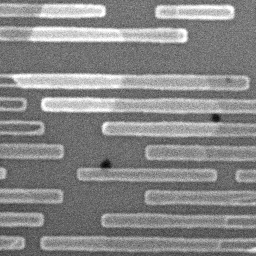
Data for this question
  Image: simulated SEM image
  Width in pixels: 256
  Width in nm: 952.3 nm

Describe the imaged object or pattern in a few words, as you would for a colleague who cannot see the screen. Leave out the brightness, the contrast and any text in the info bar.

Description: wiring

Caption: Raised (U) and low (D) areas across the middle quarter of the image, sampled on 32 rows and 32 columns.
DDDDDDDDDDDDDDDDDDDDDDDDDDDDDDDD
DDDDDDDDDDDDDDDDDDDDDDDDDDDDDDDD
DDDDDDDDDDDDDDDDDDDDDDDDDDDDDDDD
UUUUUUUUUUUUUUUUUUUUUUUUUUUUUUUU
UUUUUUUUUUUUUUUUUUUUUUUUUUUUUUUU
UUUUUUUUUUUUUUUUUUUUUUUUUUUUUUUU
DDDDDDDDDDDDDDDDDDDDDDDDDDDDDDDD
DDDDDDDDDDDDDDDDDDDDDDDDDDDDDDDD
DDDDDDDDDDDDDDDDDDDDDDDDDDDDDDDD
UUUUUUUUUUUUUUUUUUUUUUUUUUUUUUUU
UUUUUUUUUUUUUUUUUUUUUUUUUUUUUUUU
UUUUUUUUUUUUUUUUUUUUUUUUUUUUUUUU
DDDDDDDDDDDDDDDDDDDDDDDDDDDDDDDD
DDDDDDDDDDDDDDDDDDDDDDDDDDDDDDDD
DDDDDDDDDDDDDDDDDDDDDDDDDDDDDDDD
DDDDDDDDDDUUUUUUUUUUUUUUUUUUUUUU
DDDDDDDDDDUUUUUUUUUUUUUUUUUUUUUU
DDDDDDDDDDUUUUUUUUUUUUUUUUUUUUUU
DDDDDDDDDDDDDDDDDDDDDDDDDDDDDDDD
DDDDDDDDDDDDDDDDDDDDDDDDDDDDDDDD
DDDDDDDDDDDDDDDDDDDDDDDDDDDDDDDD
DDDDDDDDDDDDDDDDDDDDDUUUUUUUUUUU
DDDDDDDDDDDDDDDDDDDDDUUUUUUUUUUU
DDDDDDDDDDDDDDDDDDDDDUUUUUUUUUUU
DDDDDDDDDDDDDDDDDDDDDDDDDDDDDDDD
DDDDDDDDDDDDDDDDDDDDDDDDDDDDDDDD
DDDDUUUUUUUUUUUUUUUUUUUUUUUUUUUU
DDDDUUUUUUUUUUUUUUUUUUUUUUUUUUUU
DDDDUUUUUUUUUUUUUUUUUUUUUUUUUUUU
DDDDDDDDDDDDDDDDDDDDDDDDDDDDDDDD
DDDDDDDDDDDDDDDDDDDDDDDDDDDDDDDD
DDDDDDDDDDDDDDDDDDDDDDDDDDDDDDDD